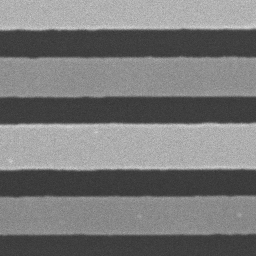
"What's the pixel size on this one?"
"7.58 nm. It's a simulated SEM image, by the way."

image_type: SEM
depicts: lines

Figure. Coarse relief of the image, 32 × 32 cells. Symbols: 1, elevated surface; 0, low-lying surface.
11111111111111111111111111111111
11111111111111111111111111111111
11111111111111111111111111111111
11111111111111111111111011111111
00000000000000000000000000000000
00000000000000000000000000000000
00000000000000000000000000000000
11111111111111111111111111111111
11111111111111111111111111111111
11111111111111111111111111111111
11111111111111111111111111111111
11111111111111111111111111111111
00000000000000000000000000000000
00000000000000000000000000000000
00000000000000000000000000000000
00000000000000100000000001110011
11111111111111111111111111111111
11111111111111111111111111111111
11111111111111111111111111111111
11111111111111111111111111111111
11111111111111111111111111111111
00000000000000000000000000000000
00000000000000000000000000000000
00000000000000000000000000000000
00000000000000000000000000000000
11111111111111111111111111111111
11111111111111111111111111111111
11111111111111111111111111111111
11111111111111111111111111111111
00000000000000000000000000000000
00000000000000000000000000000000
00000000000000000000000000000000